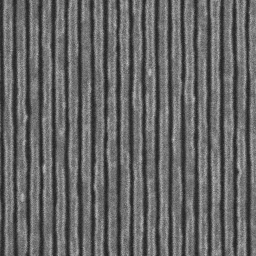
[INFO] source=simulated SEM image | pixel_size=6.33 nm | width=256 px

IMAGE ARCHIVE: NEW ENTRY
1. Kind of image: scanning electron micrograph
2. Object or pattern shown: parallel lines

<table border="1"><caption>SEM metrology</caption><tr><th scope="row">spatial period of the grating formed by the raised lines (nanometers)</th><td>81.9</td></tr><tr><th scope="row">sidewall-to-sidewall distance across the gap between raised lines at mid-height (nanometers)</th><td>30.8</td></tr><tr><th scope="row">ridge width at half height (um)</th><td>0.0498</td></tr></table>